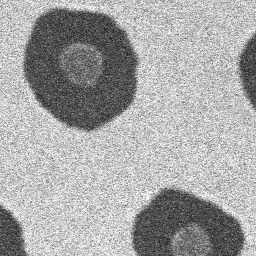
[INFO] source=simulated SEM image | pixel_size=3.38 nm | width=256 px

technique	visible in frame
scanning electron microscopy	ring-shaped grooves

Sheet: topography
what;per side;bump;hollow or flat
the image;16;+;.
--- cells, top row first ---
+++.++++++++++++
++.....+++++++++
++......+++++++.
+...++...++++++.
+...++...++++++.
++.......++++++.
++......++++++++
++++...+++++++++
++++++++++++++++
++++++++++++++++
++++++++++++++++
++++++++++++++++
+++++++++....+++
.+++++++.......+
.+++++++...++..+
..++++++...++..+